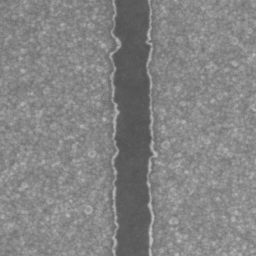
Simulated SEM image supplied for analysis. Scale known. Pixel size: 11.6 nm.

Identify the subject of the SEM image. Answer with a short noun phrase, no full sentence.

one or a few lines or trenches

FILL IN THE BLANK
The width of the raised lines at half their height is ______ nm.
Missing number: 433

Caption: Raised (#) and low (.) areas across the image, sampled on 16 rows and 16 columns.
.......##.......
.......##.......
.......##.......
.......##.......
.......##.......
.......##.......
.......##.......
.......###......
.......###......
.......###......
.......##.......
.......##.......
.......##.......
.......###......
.......##.......
.......##.......